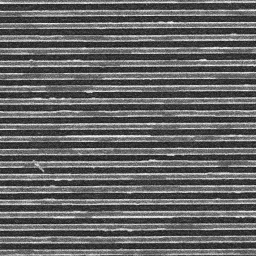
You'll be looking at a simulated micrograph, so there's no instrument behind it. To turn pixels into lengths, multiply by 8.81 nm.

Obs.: parallel lines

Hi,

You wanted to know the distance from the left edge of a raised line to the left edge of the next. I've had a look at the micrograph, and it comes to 111 nm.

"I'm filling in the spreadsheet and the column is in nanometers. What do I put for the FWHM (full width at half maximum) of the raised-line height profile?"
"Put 50.6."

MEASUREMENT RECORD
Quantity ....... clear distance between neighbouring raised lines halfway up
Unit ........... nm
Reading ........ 58.4